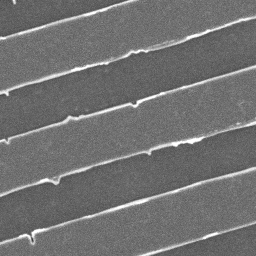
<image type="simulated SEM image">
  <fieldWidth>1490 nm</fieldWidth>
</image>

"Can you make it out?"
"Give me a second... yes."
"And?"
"one or a few lines or trenches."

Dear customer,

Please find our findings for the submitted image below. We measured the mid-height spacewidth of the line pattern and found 263 nm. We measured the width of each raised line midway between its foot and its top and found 0.309 um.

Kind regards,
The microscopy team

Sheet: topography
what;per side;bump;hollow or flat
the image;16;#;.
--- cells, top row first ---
.......#########
...###########..
############....
########........
####...........#
#..........#####
........########
....############
.############...
#########.......
######..........
##..........####
.........#######
......##########
..############..
###########.....